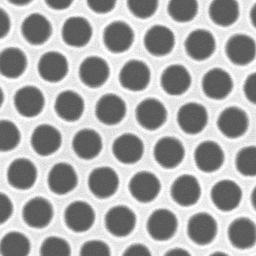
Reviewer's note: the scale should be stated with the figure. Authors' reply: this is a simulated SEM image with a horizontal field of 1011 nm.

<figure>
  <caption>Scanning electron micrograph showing a regular array of holes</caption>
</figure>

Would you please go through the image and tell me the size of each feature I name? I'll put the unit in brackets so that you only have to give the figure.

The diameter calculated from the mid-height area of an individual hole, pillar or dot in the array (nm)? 122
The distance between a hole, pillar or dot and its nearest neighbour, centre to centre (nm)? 162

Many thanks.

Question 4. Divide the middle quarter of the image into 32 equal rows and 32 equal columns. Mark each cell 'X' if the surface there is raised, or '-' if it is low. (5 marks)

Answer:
-XXX-------XXXX------XXXXX----XX
-XXX-------XXX-------XXXX------X
-XXX-------XXX--------XXX------X
XXXX-------XXX--------XX--------
XXXXX-----XXXX-------XXX--------
XXXXXX---XXXXX-------XXX-------X
XXXXXXXXXXXXXXXX----XXXXX------X
----XXXXXX---XXXXXXXXXXXXX----XX
----XXXXX-----XXXXXXXXXXXXXXXXXX
-----XXX-------XXXX-----XXXXXXXX
-----XXX-------XXX-------XXXX---
-----XXX--------XX--------XXX---
-----XXX-------XXX--------XX----
----XXXX-------XXX-------XXX----
XXXXXXXXX-----XXXXX------XXX----
XXXXXXXXXXXXXXXXXXX-----XXXXX---
XXXX---XXXXXXXXXXXXXX-XXXXXXXX--
XXX------XXXXXX--XXXXXXXXXXXXXX-
XX-------XXXX------XXXXX----XXXX
XX-------XXX--------XXX------XXX
XX--------XX--------XXX-------XX
XX-------XXX--------XX--------XX
XXX------XXX--------XX--------XX
XXXX---XXXXXX------XXXX-------XX
XXXXXXXXXXXXXX----XXXXX------XXX
--XXXXXXXX-XXXXXXXXXXXXX----XXXX
---XXXX-----XXXXXXXXXXXXXXXXXXXX
---XXXX------XXXXX----XXXXXXXXXX
---XXX--------XXX------XXXXX----
---XXX--------XX--------XXX-----
---XXX--------XX--------XXX-----
--XXXXX------XXX--------XXX-----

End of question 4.